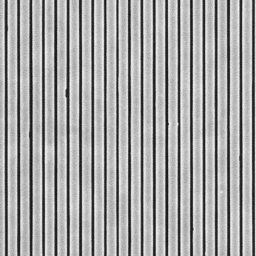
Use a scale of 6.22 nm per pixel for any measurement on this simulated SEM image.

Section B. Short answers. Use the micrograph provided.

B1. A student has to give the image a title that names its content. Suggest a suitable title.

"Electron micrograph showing parallel lines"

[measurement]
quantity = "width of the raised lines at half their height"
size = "57.5 nanometres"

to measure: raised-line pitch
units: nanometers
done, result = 76.9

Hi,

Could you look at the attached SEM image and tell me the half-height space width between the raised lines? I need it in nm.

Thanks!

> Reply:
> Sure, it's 21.